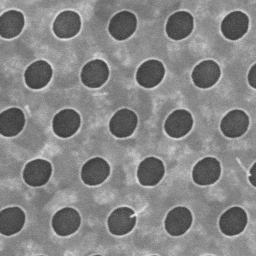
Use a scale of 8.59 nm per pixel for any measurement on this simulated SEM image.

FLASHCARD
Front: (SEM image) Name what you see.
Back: a regular array of holes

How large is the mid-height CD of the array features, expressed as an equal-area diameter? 0.254 microns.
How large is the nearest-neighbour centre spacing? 477 nm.